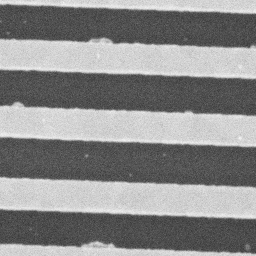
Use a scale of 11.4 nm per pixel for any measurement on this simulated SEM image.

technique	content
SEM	lines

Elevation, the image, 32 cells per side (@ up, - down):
@@@@@@@@@@@@@@@@@@@@@@@@@@@@@@@@
------------------------------@@
--------------------------------
--------------------------------
--------------------------------
@@@@@@@@@@@@@@-@@@--------------
@@@@@@@@@@@@@@@@@@@@@@@@@@@@@@@@
@@@@@@@@@@@@@@@@@@@@@@@@@@@@@@@@
@@@@@@@@@@@@@@@@@@@@@@@@@@@@@@@@
-----------------------@@@@@@@@@
--------------------------------
--------------------------------
--------------------------------
@@@@@@--------------------------
@@@@@@@@@@@@@@@@@@@@@@@@@@@@@@@-
@@@@@@@@@@@@@@@@@@@@@@@@@@@@@@@@
@@@@@@@@@@@@@@@@@@@@@@@@@@@@@@@@
----------@@@@@@@@@@@@@@@@@@@@@@
--------------------------------
--------------------------------
--------------------------------
--------------------------------
@@@@@@@-------------------------
@@@@@@@@@@@@@@@@@@@@@@@@@@@@@@@@
@@@@@@@@@@@@@@@@@@@@@@@@@@@@@@@@
@@@@@@@@@@@@@@@@@@@@@@@@@@@@@@@@
-----------@@@@@@@@@@@@@@@@@@@@@
--------------------------------
--------------------------------
--------------------------------
--------------------------------
@@@@@@@@@@@@@@@@@@@@@@@@@-------